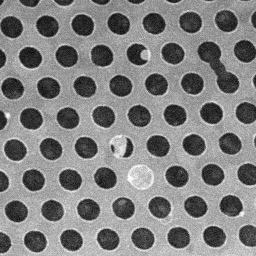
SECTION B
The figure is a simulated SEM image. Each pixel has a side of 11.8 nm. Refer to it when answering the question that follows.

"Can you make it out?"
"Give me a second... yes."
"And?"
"a regular array of holes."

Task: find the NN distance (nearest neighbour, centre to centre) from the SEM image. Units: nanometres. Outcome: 412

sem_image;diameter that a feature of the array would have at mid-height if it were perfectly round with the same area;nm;274